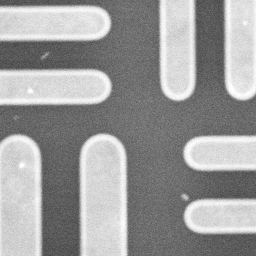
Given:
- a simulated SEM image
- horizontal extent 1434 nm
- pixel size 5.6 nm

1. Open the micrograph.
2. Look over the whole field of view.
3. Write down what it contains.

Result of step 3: groups of lines, slits or small figures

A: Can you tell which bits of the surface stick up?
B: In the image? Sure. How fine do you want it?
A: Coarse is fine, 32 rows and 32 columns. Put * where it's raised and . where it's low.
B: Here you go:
....................****....****
*************.......****....****
**************......****....****
*************.......****....****
************........****....****
....................****....****
....................****....****
....................****....****
....................****....****
*************.......****....****
**************......****....****
*************........***.....***
************....................
................................
................................
................................
................................
.***.......***..........********
*****......****........*********
*****.....*****........*********
*****.....*****.........********
*****.....*****.................
*****.....*****.................
*****.....******................
*****.....******................
*****.....******........********
*****.....******.......*********
*****.....******.......*********
*****.....******........********
*****.....******................
*****.....******................
*****.....******................